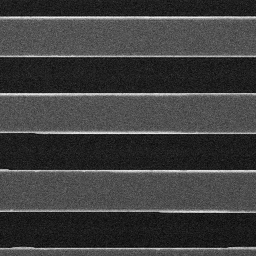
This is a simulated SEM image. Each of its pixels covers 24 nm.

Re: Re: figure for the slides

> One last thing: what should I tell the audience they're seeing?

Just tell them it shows lines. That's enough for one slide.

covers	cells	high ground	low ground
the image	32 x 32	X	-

--------------------------------
--------------------------------
XXXXXXXXXXXXXXXXXXXXXXXXXXXXXXXX
XXXXXXXXXXXXXXXXXXXXXXXXXXXXXXXX
XXXXXXXXXXXXXXXXXXXXXXXXXXXXXXXX
XXXXXXXXXXXXXXXXXXXXXXXXXXXXXXXX
XXXXXXXXXXXXXXXXXXXXXXXXXXXXXXXX
--------------------------------
--------------------------------
--------------------------------
--------------------------------
--------------------------------
XXXXXXXXXXXXXXXXXXXXXXXXXXXXXXXX
XXXXXXXXXXXXXXXXXXXXXXXXXXXXXXXX
XXXXXXXXXXXXXXXXXXXXXXXXXXXXXXXX
XXXXXXXXXXXXXXXXXXXXXXXXXXXXXXXX
XXXXXXXXXXXXXXXXXXXXXXXXXXXXXXXX
--------------------------------
--------------------------------
--------------------------------
--------------------------------
XXXXXXXXXXXXXXXXXXXXXXXXXXXXXXXX
XXXXXXXXXXXXXXXXXXXXXXXXXXXXXXXX
XXXXXXXXXXXXXXXXXXXXXXXXXXXXXXXX
XXXXXXXXXXXXXXXXXXXXXXXXXXXXXXXX
XXXXXXXXXXXXXXXXXXXXXXXXXXXXXXXX
--------------------XXXXXXXXXXXX
--------------------------------
--------------------------------
--------------------------------
--------------------------------
XXXXXXXXXXXXXXXXXXXXXXXXXXXXXXXX